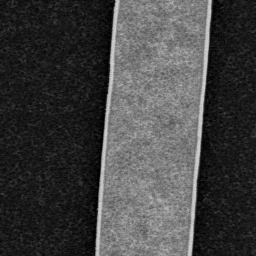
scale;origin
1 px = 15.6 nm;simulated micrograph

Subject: one or a few lines or trenches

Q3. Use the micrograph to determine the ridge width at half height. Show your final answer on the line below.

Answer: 1470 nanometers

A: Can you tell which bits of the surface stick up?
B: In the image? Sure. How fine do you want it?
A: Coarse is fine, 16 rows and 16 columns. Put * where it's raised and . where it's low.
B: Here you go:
.......******...
.......******...
.......******...
.......******...
.......******...
.......******...
.......******...
.......******...
.......*****....
......******....
......******....
......******....
......******....
......******....
......******....
......******....